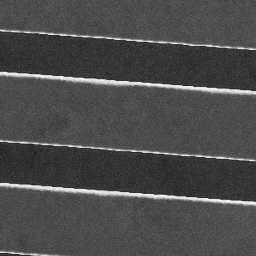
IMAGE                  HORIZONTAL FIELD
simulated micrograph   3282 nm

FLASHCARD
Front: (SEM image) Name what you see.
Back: lines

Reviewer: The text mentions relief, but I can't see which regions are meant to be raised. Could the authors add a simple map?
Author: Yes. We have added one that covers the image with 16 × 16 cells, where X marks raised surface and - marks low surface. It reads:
XXXXXXXXXXXXXXXX
XXXXXXXXXXXXXXXX
--------XXXXXXXX
----------------
----------------
XXXXXXXXXXXXX---
XXXXXXXXXXXXXXXX
XXXXXXXXXXXXXXXX
XXXXXXXXXXXXXXXX
---------XXXXXXX
----------------
----------------
XXXXXXXXXXXXXX--
XXXXXXXXXXXXXXXX
XXXXXXXXXXXXXXXX
XXXXXXXXXXXXXXXX